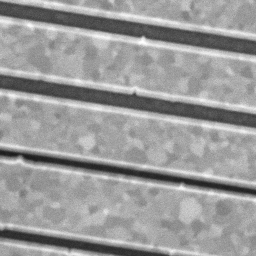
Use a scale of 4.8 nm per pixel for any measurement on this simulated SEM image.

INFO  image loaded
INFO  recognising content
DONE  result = one or a few lines or trenches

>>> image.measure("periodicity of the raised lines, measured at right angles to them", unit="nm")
349